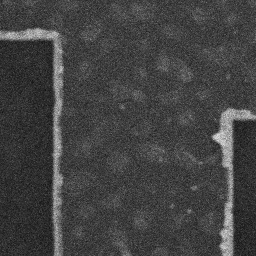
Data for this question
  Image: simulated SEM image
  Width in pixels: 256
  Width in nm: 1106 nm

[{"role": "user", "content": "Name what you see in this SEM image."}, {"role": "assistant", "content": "one or a few lines or trenches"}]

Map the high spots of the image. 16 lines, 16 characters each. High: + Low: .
++++++++++++++++
++++++++++++++++
...+++++++++++++
...+++++++++++++
....++++++++++++
....++++++++++++
....++++++++++++
...++++++++++++.
...+++++++++++..
...+++++++++++..
...+++++++++++..
...+++++++++++..
...+++++++++++..
...+++++++++++..
...+++++++++++..
....++++++++++..